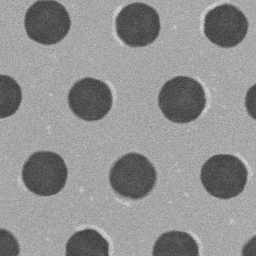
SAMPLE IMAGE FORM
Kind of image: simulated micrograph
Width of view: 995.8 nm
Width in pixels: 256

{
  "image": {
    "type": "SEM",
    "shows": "holes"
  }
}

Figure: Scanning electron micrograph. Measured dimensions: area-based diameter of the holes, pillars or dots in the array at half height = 180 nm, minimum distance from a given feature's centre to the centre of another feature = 338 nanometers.